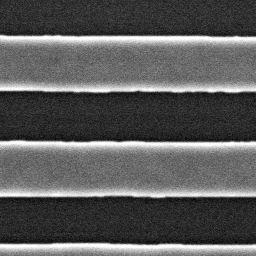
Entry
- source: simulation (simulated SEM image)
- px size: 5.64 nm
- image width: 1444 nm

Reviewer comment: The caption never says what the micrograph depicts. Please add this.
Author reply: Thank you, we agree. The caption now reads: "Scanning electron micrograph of lines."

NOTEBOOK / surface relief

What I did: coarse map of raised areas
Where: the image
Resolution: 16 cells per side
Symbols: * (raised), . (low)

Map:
................
................
****************
****************
****************
****************
................
................
................
****************
****************
****************
................
................
................
****************